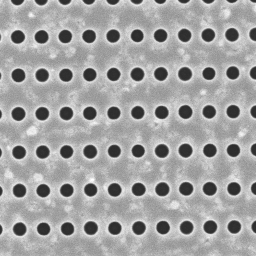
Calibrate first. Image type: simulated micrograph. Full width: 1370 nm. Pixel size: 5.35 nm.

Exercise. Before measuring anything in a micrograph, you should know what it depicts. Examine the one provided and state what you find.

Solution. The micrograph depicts a regular array of holes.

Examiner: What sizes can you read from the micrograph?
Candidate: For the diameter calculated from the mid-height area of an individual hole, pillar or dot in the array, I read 0.0714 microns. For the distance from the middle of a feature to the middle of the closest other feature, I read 127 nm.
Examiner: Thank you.